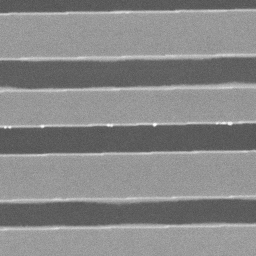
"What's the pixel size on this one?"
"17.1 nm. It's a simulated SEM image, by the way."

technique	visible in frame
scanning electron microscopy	lines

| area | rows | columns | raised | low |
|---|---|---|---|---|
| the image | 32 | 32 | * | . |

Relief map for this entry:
................................
...................*************
********************************
********************************
********************************
********************************
********************************
................................
................................
................................
................................
********************************
********************************
********************************
********************************
********************........*...
................................
................................
................................
********************************
********************************
********************************
********************************
********************************
********************************
................................
................................
................................
.............*******************
********************************
********************************
********************************